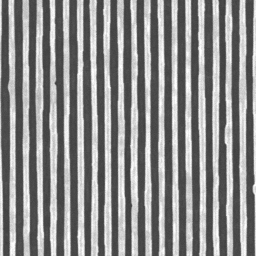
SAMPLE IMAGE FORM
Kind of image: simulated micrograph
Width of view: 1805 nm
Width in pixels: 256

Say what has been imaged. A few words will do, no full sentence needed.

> parallel lines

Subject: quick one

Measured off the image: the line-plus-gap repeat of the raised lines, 95.6 nm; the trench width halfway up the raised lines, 0.0555 um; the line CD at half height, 43.2 nm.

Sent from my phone